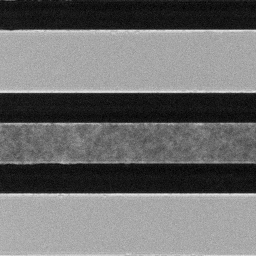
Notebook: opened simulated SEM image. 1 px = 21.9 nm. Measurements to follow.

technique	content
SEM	lines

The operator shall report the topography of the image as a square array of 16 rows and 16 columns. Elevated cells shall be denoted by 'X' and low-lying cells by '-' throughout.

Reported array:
----------------
----------------
XXXXXXXXXXXXXXXX
XXXXXXXXXXXXXXXX
XXXXXXXXXXXXXXXX
XXXXXXXXXXXXXXXX
----------------
----------------
XXXXXXXXXXXXXXXX
XXXXXXXXXXXXXXXX
----------------
----------------
XXXXXXXXXXXXXXXX
XXXXXXXXXXXXXXXX
XXXXXXXXXXXXXXXX
XXXXXXXXXXXXXXXX